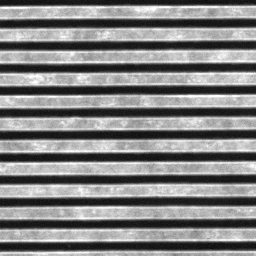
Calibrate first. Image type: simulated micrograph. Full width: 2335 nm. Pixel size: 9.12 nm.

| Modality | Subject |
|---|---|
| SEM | parallel lines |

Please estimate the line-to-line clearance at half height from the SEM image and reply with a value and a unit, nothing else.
89 nm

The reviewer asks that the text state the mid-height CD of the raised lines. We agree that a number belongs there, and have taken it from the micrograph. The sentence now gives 113 nm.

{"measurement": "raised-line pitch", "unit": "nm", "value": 203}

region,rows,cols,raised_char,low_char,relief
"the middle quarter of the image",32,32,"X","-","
--------------------------------
--------------------------------
XXXXXXXXXXXXXXXXXXXXXXXXXXXXXXXX
XXXXXXXXXXXXXXXXXXXXXXXXXXXXXXXX
XXXXXXXXXXXXXXXXXXXXXXXXXXXXXXXX
--------------------------------
--------------------------------
--------------------------------
XXXXXXXXXXXXXXXXXXXXXXXXXXXXXXXX
XXXXXXXXXXXXXXXXXXXXXXXXXXXXXXXX
XXXXXXXXXXXXXXXXXXXXXXXXXXXXXXXX
--------------------------------
--------------------------------
XXXXXXXXXXXXXXXXXXXXXX----XXXXXX
XXXXXXXXXXXXXXXXXXXXXXXXXXXXXXXX
XXXXXXXXXXXXXXXXXXXXXXXXXXXXXXXX
XXXXXXX-------------------------
--------------------------------
--------------------------------
XXXXXXXXXXXXXXXXXXXXXXXXXXXXXXXX
XXXXXXXXXXXXXXXXXXXXXXXXXXXXXXXX
XXXXXXXXXXXXXXXXXXXXXXXXXXXXXXXX
--------------------------------
--------------------------------
--------------------------------
XXXXXXXXXXXXXXXXXXXXXXXXXXXXXXXX
XXXXXXXXXXXXXXXXXXXXXXXXXXXXXXXX
XXXXXXXXXXXXXXXXX---------------
--------------------------------
--------------------------------
XXXXXXXXXXXXXXXXXXXXXXXXXXXXXXXX
XXXXXXXXXXXXXXXXXXXXXXXXXXXXXXXX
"